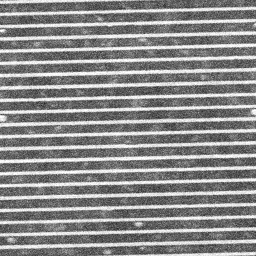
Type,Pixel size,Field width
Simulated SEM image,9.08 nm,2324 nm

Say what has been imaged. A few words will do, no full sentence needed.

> parallel lines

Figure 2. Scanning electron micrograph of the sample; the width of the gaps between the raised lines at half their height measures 86.2 nanometres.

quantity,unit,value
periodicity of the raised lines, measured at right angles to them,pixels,12.2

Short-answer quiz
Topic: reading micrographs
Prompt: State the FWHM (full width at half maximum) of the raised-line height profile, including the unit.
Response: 26.1 nanometres